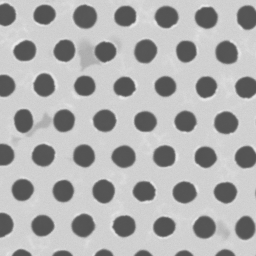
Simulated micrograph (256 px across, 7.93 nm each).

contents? a regular array of holes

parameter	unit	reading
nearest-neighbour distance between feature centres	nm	316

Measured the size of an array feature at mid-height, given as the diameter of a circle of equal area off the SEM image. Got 170 nm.